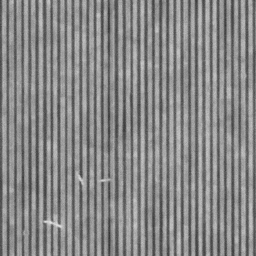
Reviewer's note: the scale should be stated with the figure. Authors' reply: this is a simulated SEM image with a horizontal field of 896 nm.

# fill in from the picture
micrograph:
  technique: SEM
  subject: parallel lines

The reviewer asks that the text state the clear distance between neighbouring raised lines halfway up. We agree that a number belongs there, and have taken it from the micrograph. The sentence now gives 3.74 pixels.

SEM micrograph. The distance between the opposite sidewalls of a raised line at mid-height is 13.5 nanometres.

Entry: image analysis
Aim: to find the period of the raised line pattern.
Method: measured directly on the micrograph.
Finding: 25.3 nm